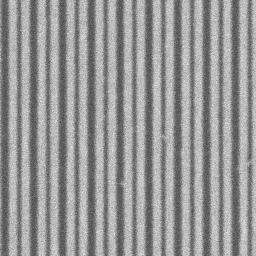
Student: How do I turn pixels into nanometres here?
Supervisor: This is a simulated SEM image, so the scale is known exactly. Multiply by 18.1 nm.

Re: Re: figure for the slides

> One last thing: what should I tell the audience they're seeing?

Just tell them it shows parallel lines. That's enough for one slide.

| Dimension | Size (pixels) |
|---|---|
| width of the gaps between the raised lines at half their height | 6.88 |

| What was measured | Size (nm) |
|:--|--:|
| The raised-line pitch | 262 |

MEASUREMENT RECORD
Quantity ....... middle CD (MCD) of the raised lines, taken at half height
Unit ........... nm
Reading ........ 109